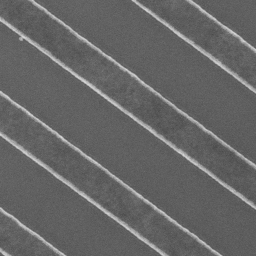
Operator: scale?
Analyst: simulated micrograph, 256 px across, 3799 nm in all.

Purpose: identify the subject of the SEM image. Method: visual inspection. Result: lines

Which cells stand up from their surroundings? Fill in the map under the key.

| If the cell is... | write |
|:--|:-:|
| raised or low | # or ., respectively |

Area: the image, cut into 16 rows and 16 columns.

###......####...
####......####..
..###.......###.
...####......###
....####......##
......###.......
#......####.....
##......####....
####......###...
.####......####.
...####......###
....####......##
......###......#
#......###......
##......####....
###.......###...